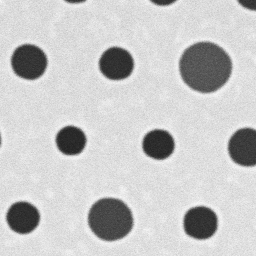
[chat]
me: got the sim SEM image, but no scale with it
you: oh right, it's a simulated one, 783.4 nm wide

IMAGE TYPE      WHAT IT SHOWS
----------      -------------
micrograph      holes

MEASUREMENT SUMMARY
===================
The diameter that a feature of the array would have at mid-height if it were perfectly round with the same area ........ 107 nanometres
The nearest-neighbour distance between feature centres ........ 0.269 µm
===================